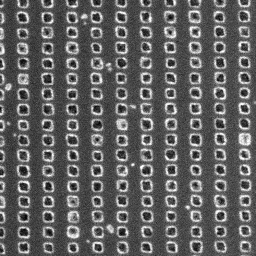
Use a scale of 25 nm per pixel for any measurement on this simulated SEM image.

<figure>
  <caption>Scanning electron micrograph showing a regular array of raised bodies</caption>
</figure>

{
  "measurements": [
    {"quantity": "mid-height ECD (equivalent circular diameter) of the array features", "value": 10.5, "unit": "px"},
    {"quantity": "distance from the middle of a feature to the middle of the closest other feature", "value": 378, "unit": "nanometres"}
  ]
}